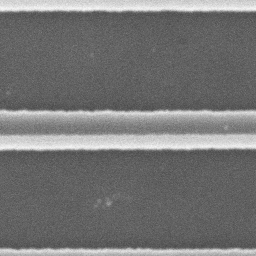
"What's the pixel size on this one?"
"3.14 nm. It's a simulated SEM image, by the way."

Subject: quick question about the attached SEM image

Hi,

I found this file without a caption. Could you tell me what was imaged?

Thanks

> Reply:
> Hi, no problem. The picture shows lines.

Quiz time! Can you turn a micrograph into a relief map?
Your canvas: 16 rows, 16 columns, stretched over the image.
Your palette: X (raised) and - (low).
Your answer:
XXXXXXXXXXXXXXXX
----------------
----------------
----------------
----------------
----------------
----------------
XXXXXXXXXXXXXXXX
XXXXXXXXXXXXXXXX
----------------
----------------
----------------
----------------
----------------
----------------
----------------